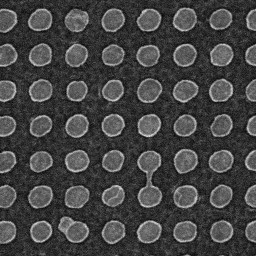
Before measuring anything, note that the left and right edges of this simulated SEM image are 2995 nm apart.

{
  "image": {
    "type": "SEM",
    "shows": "a regular array of raised bodies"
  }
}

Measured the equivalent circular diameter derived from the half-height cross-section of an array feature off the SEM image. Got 21.9 pixels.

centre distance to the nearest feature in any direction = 35.1 pixels